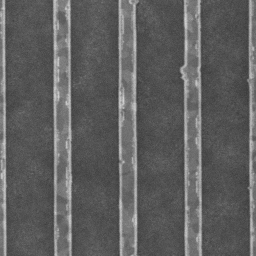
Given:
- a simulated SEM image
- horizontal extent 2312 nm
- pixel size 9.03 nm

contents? one or a few lines or trenches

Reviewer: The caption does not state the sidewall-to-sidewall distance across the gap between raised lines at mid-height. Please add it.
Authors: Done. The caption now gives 456 nanometers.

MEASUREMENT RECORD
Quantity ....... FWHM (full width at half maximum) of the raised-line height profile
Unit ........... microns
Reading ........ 0.131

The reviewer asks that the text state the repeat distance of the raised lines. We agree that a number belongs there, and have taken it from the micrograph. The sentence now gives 65.2 px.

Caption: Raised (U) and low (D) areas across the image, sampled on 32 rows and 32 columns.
DDDDDDDUUDDDDDDUUDDDDDDUUDDDDDDU
DDDDDDDUUDDDDDDUUDDDDDDUUDDDDDDU
DDDDDDDUUDDDDDDUUDDDDDDUUDDDDDDU
DDDDDDDUUDDDDDDUUDDDDDDUUDDDDDDU
DDDDDDDUUDDDDDDUUDDDDDDUUDDDDDDU
DDDDDDDUUDDDDDDUUDDDDDDUUDDDDDDU
DDDDDDDUUDDDDDDUUDDDDDDUUDDDDDDU
UDDDDDDUUDDDDDDUUDDDDDDUUDDDDDDU
UDDDDDDUUDDDDDDUUDDDDDDUUDDDDDDU
UDDDDDDUUDDDDDDUUDDDDDDUUDDDDDDU
UDDDDDDUUDDDDDDUUDDDDDDUUDDDDDDU
UDDDDDDUUDDDDDDUUDDDDDDUUDDDDDDU
UDDDDDDUUDDDDDDUUDDDDDDUUDDDDDDU
UDDDDDDUUDDDDDDUUDDDDDDUUDDDDDDU
UDDDDDDUUDDDDDDUUDDDDDDUUDDDDDDU
UDDDDDDUUDDDDDDUUDDDDDDUUDDDDDDU
UDDDDDDUUDDDDDDUUDDDDDDUUDDDDDDU
UDDDDDDUUDDDDDDUUDDDDDDUUDDDDDDU
UDDDDDDUUDDDDDDUUDDDDDDUUDDDDDDU
UDDDDDDUUDDDDDDUUDDDDDDUUDDDDDDU
UDDDDDDUUDDDDDDUUDDDDDDUUDDDDDDU
UDDDDDDUUDDDDDDUUDDDDDDUUDDDDDDU
UDDDDDDUUDDDDDDUUDDDDDDUUDDDDDDU
UDDDDDDUUDDDDDDUUDDDDDDUUDDDDDDU
UDDDDDDUUDDDDDDUUDDDDDDUUDDDDDDU
UDDDDDDUUDDDDDDUUDDDDDDUUDDDDDDU
UDDDDDDUUDDDDDDUUDDDDDDUUDDDDDDU
UDDDDDDUUDDDDDDUUDDDDDDUUDDDDDDD
UDDDDDDUUDDDDDDUUDDDDDDUUDDDDDDU
UDDDDDDUUDDDDDDUUDDDDDDUUDDDDDDD
UDDDDDDUUDDDDDDUUDDDDDDUUDDDDDDD
UDDDDDDUUDDDDDDUUDDDDDDUUDDDDDDD